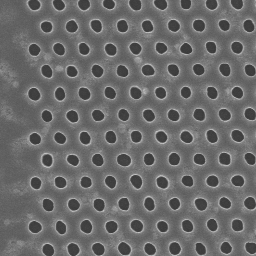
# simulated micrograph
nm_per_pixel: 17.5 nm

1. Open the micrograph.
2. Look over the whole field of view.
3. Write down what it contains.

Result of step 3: a regular array of holes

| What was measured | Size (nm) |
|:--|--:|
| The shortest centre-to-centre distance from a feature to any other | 436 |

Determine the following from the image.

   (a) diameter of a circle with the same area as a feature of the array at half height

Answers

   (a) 209 nm